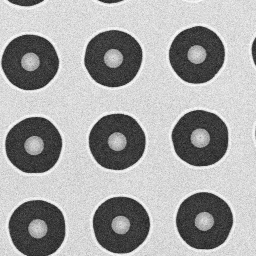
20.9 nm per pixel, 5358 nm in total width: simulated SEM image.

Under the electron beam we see an array of small figures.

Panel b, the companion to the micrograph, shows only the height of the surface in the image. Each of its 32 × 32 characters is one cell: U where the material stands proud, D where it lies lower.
UDDDDUUUUUUUUDDUUUUUUUUUUUUUUUUU
UUUUUUUUUUUUUUUUUUUUUUUUUUUUUUUU
UUUUUUUUUUUUUUUUUUUUUUUUUUUUUUUU
UUUUUUUUUUUUUUUUUUUUUUUDDDUUUUUU
UUDDDUUUUUUUDDDDDUUUUUDDDDDUUUUU
UDDDDDDUUUUDDDDDDDUUUDDDDDDDUUUD
DDDDDDDUUUUDDDDDDDUUUDDDUDDDUUUD
DDDUDDDUUUDDDUUDDDUUUDDDDDDDUUUU
DDDDDDDUUUUDDDDDDDUUUDDDDDDDUUUU
UDDDDDDUUUUDDDDDDUUUUUDDDDDUUUUU
UDDDDDUUUUUUDDDDUUUUUUUUDUUUUUUU
UUUUUUUUUUUUUUUUUUUUUUUUUUUUUUUU
UUUUUUUUUUUUUUUUUUUUUUUUUUUUUUUU
UUUUUUUUUUUUUUUUUUUUUUUUUUUUUUUU
UUUUDUUUUUUUUDDDUUUUUUUDDDDUUUUU
UUDDDDDUUUUUDDDDDUUUUUDDDDDDUUUU
UDDDDDDDUUUDDDDDDDUUUDDDDDDDDUUU
UDDDDDDDUUUDDDUDDDUUUDDDUUDDDUUU
UDDDUDDDUUUDDDDDDDUUUUDDDDDDDUUU
UDDDDDDDUUUDDDDDDDUUUUDDDDDDUUUU
UDDDDDDUUUUUDDDDDUUUUUUDDDDUUUUU
UUUDDDUUUUUUUUUUUUUUUUUUUUUUUUUU
UUUUUUUUUUUUUUUUUUUUUUUUUUUUUUUU
UUUUUUUUUUUUUUUUUUUUUUUUUUUUUUUU
UUUUUUUUUUUUUUDDUUUUUUUUDDDUUUUU
UUDDDDDUUUUUDDDDDDUUUUDDDDDDDUUU
UUDDDDDDUUUUDDDDDDDUUUDDDDDDDUUU
UDDDDDDDUUUUDDDDDDDUUUDDDUDDDUUU
UDDDUDDDUUUUDDDUDDDUUUDDDDDDDUUU
UDDDDDDDUUUUDDDDDDDUUUDDDDDDDUUU
UUDDDDDDUUUUDDDDDDUUUUUDDDDDUUUU
UUDDDDDUUUUUUUDDDUUUUUUUUUUUUUUU